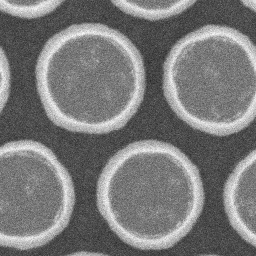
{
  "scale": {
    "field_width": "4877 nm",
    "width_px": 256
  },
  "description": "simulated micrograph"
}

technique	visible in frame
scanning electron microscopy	raised bodies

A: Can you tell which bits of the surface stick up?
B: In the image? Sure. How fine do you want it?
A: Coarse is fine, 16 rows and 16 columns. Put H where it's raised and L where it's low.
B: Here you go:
HHHLLLLLHHHLLLLL
LLLLLLLLLLLLLLLL
LLLLHHHHLLLLHHHL
LLLHHHHHLLLHHHHH
LLLHHHHHHLHHHHHH
LLLHHHHHHLLHHHHH
LLLHHHHHLLLHHHHH
LLLLHHHHLLLLHHHL
LLLLLLLLLLLLLLLL
HHHLLLLLHHHLLLLL
HHHHLLLHHHHHLLLH
HHHHLLHHHHHHLLHH
HHHHLLHHHHHHLLHH
HHHHLLLHHHHHLLLH
HHHLLLLLHHHLLLLH
LLLLLLLLLLLLLLLL